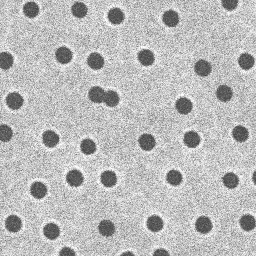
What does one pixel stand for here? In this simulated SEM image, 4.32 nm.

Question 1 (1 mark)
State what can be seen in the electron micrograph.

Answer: a regular array of holes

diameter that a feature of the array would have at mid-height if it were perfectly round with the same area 0.0759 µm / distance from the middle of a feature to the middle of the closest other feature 0.168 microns